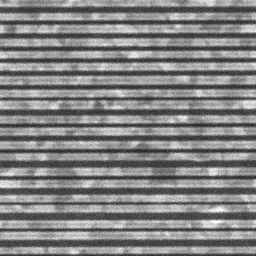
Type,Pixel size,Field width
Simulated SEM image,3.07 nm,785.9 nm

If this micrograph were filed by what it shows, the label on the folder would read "parallel lines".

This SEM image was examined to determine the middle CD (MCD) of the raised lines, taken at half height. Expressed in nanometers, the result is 19.9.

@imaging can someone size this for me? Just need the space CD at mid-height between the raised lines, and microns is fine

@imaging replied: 0.0199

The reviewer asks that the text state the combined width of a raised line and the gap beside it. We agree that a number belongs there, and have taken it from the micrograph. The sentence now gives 39.8 nm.